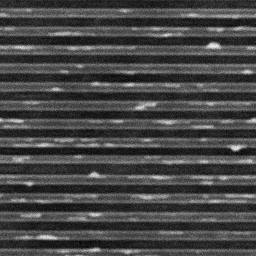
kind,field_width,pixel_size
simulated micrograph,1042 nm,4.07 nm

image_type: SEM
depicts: parallel lines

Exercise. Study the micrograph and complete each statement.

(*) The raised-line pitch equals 75.4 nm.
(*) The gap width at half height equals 39.2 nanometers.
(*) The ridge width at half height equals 35.1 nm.